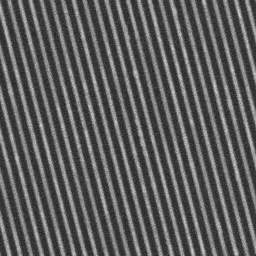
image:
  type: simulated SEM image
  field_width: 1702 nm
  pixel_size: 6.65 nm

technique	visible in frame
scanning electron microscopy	parallel lines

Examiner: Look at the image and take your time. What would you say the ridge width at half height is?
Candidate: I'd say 23.3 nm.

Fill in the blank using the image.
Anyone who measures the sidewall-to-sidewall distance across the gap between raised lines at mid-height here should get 46.7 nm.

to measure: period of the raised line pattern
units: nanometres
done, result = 69.6